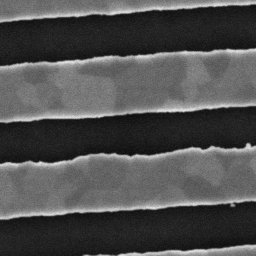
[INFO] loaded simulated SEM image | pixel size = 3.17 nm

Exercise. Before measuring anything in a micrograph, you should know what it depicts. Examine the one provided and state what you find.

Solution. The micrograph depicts lines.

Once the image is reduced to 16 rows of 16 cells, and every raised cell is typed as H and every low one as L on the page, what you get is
HHHHHHHHHHHHLLLL
LLLLLLLLLLLLLLLL
LLLLLLLLLLLLLLLL
LLLLLLLLHHHHHHHH
HHHHHHHHHHHHHHHH
HHHHHHHHHHHHHHHH
HHHHHHHHHHHHHHHH
HHLLLLLLLLLLLLLL
LLLLLLLLLLLLLLLL
LLLLLLLLLLLHHHHH
HHHHHHHHHHHHHHHH
HHHHHHHHHHHHHHHH
HHHHHHHHHHHHHHHH
HHLLLLLLLLLLLLLL
LLLLLLLLLLLLLLLL
LLLLLLLLLLLLLLHH